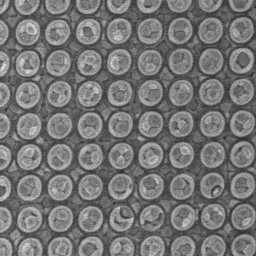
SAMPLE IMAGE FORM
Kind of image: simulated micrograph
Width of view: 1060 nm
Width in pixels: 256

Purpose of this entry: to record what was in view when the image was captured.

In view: a regular array of raised bodies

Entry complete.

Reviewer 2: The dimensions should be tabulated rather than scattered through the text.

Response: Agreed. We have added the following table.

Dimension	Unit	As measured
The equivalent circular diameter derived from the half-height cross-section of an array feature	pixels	24.2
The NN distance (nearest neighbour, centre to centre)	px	30.2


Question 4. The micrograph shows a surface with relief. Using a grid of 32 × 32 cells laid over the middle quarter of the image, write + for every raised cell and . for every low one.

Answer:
+..++++++..+++++...+++++..++++++
+...+++++..+++++...+++++...++++.
.....++......+......++..........
................................
.............+++.....++.....+++.
+....++++...+++++...++++...+++++
++..+++++..++++++..++++++..+++++
++..+++++..++++++..++++++..+++++
++..+++++..++++++..+++++...+++++
+...+++++...++++....++++...++++.
................................
................................
......+......+++....++++....+++.
+...+++++...+++++..+++++...+++++
++..+++++..++++++..+++++..++++++
++..+++++..++++++..+++++..++++++
+...+++++..++++++..+++++...+++++
+...++++....++++....+++....++++.
......+.........................
................................
......++.....+++....++++....+++.
+...+++++...+++++..+++++...+++++
++..+++++..++++++..+++++...+++++
++..+++++..++++++..+++++...+++++
+...+++++...++++...+++++...+++++
+....+++....++++....+++.....+++.
................................
................................
+....++++....++++...++++....++++
++..+++++...+++++..++++++..+++++
++..++++++.+++++...++++++..+++++
++..++++++.++++++..++++++..+++++